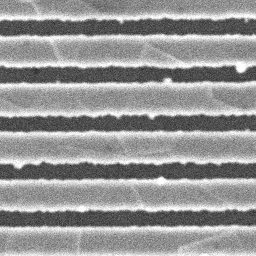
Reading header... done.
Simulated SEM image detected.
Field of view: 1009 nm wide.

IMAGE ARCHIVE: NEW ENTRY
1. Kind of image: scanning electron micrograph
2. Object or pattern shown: lines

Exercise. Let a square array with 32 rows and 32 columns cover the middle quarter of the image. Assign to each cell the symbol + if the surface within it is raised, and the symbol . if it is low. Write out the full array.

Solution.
...+++++.+.....+.+.....+++++++++
................................
................................
................................
................................
++++++++++++++++++++++++++++++++
++++++++++++++++++++++++++++++++
++++++++++++++++++++++++++++++++
++++++++++++++++++++++++++++++++
++++++++++++++++++++++++++++++++
++++++++++++++++++++++++++++++++
++++++++++++++++++++++++++++++++
++++++++++++++++++++++++++++++++
................................
................................
................................
................................
++++++++++++++++++++++++++++++++
++++++++++++++++++++++++++++++++
++++++++++++++++++++++++++++++++
++++++++++++++++++++++++++++++++
++++++++++++++++++++++++++++++++
++++++++++++++++++++++++++++++++
++++++++++++++++++++++++++++++++
+++++.+++++++++++++++++++++..++.
................................
................................
................................
........................+.......
++++++++++++++++++++++++++++++++
++++++++++++++++++++++++++++++++
++++++++++++++++++++++++++++++++